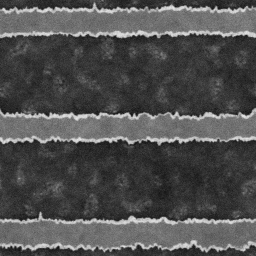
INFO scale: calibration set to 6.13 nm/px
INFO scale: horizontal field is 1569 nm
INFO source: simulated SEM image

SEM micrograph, one or a few lines or trenches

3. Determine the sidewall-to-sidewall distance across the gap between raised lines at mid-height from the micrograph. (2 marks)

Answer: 484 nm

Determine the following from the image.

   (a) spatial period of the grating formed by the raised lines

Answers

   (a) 650 nanometers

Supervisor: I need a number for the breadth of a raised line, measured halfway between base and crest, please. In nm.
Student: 166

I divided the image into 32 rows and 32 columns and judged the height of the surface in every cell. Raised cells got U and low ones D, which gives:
DDDDDDDDDDDDDDDDDDDDDDDDDDDDDDDD
UUUUUUUUUUUUUUUUUUUUUUUUUUUUUUUU
UUUUUUUUUUUUUUUUUUUUUUUUUUUUUUUU
UUUUUUUUUUUUUUUUUUUUUUUUUUUUUUUU
UUDDDDDDDUDDDDUUDDUUDDDDDDDDDDDU
DDDDDDDDDDDDDDDDDDDDDDDDDDDDDDDD
DDDDDDDDDDDDDDDDDDDDDDDDDDDDDDDD
DDDDDDDDDDDDDDDDDDDDDDDDDDDDDDDD
DDDDDDDDDDDDDDDDDDDDDDDDDDDDDDDD
DDDDDDDDDDDDDDDDDDDDDDDDDDDDDDDD
DDDDDDDDDDDDDDDDDDDDDDDDDDDDDDDD
DDDDDDDDDDDDDDDDDDDDDDDDDDDDDDDD
DDDDDDDDDDDDDDDDDDDDDDDDDDDDDDDD
DDDDDDDDDDDDDDDDDDDDDDDDDDDDDDDD
UUUUUUUUUUUUUUUUUUUUUUUDDUUUUUUU
UUUUUUUUUUUUUUUUUUUUUUUUUUUUUUUU
UUUUUUUUUUUUUUUUUUUUUUUUUUUUUUUU
UUUUUUUUUUUUUUUDUUUUUUUUUUUUUDUU
DDDDDDDDDDDDDDDDDDDDDDDDDDDDDDDD
DDDDDDDDDDDDDDDDDDDDDDDDDDDDDDDD
DDDDDDDDDDDDDDDDDDDDDDDDDDDDDDDD
DDDDDDDDDDDDDDDDDDDDDDDDDDDDDDDD
DDDDDDDDDDDDDDDDDDDDDDDDDDDDDDDD
DDDDDDDDDDDDDDDDDDDDDDDDDDDDDDDD
DDDDDDDDDDDDDDDDDDDDDDDDDDDDDDDD
DDDDDDDDDDDDDDDDDDDDDDDDDDDDDDDD
DDDDDDDDDDDDDDDDDDDDDDDDDDDDDDDD
UUDDUUUDDDDUDDDUUUUUUDDUUUDDDDUU
UUUUUUUUUUUUUUUUUUUUUUUUUUUUUUUU
UUUUUUUUUUUUUUUUUUUUUUUUUUUUUUUU
UUUUUUUUUUUUUUUUUUUUUUUUUUUUUUUU
DDDDDDDDDDDDDDDDDDDDDDDDDDDDDDDD